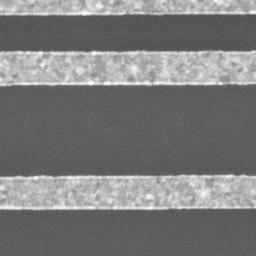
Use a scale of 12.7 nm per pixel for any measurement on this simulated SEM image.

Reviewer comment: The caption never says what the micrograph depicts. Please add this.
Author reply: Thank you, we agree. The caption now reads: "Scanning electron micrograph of lines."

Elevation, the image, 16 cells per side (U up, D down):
UUUUUUUUUUUUUUUU
DDDDDDDDDDDDDDDD
DDDDDDDDDDDDDDDD
UUUUUUUUUUUUUUUU
UUUUUUUUUUUUUUUU
DDDDDDDDDDDDDDDD
DDDDDDDDDDDDDDDD
DDDDDDDDDDDDDDDD
DDDDDDDDDDDDDDDD
DDDDDDDDDDDDDDDD
DDDDDDDDDDDDDDDD
UUUUUUUUUUUUUUUU
UUUUUUUUUUUUUUUU
DDDDDDDDDDDDDDDD
DDDDDDDDDDDDDDDD
DDDDDDDDDDDDDDDD